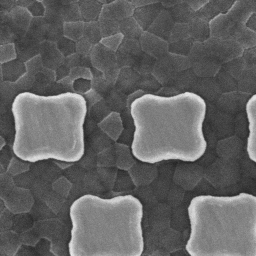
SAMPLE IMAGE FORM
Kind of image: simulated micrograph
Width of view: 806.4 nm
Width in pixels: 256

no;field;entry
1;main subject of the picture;raised bodies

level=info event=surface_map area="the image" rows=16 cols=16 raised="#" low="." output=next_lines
................
................
................
................
................
................
.####...#####...
.####...#####...
.####...#####...
.####...#####...
................
................
.....###....####
....#####...####
....#####...####
....#####...####